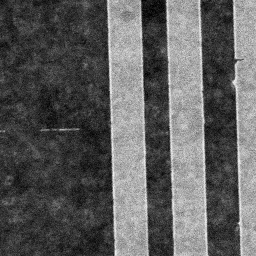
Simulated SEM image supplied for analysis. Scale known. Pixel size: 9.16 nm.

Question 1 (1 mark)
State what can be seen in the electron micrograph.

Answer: one or a few lines or trenches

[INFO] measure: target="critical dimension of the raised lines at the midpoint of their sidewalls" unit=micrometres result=0.301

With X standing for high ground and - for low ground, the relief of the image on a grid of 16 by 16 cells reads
-------XX-XX---X
-------XX-XXX--X
-------XX--XX--X
-------XX--XX--X
-------XX--XX--X
-------XX--XX--X
-------XX--XX--X
-------XX--XX--X
-------XX--XX--X
-------XX--XX--X
-------XX--XX--X
-------XX--XX--X
-------XX--XX--X
-------XX--XX--X
-------XX--XX--X
-------XX--XX--X